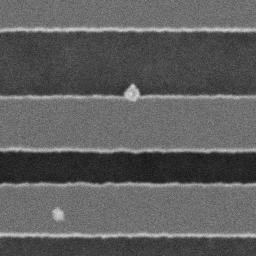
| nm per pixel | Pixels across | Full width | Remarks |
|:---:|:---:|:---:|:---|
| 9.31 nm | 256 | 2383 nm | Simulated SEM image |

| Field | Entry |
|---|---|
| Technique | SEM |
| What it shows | lines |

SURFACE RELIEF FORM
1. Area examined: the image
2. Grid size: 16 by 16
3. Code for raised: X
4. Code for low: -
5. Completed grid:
XXXXXXXXXXXXXXXX
XXXXXXXXXXXXXXXX
----------------
----------------
----------------
----------------
XXXXXXXXXXXXXXXX
XXXXXXXXXXXXXXXX
XXXXXXXXXXXXXXXX
----------------
----------------
-XXXXXXXXXXXXXXX
XXXXXXXXXXXXXXXX
XXXXXXXXXXXXXXXX
XXXXXXXXXXXXXXXX
----------------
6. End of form